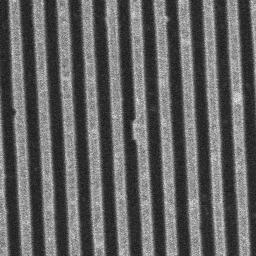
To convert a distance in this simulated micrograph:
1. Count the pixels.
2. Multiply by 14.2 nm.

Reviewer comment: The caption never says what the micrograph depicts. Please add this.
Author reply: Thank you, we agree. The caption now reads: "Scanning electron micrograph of parallel lines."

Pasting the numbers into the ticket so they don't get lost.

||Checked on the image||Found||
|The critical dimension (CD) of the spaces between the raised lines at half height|176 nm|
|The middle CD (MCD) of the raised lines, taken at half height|0.163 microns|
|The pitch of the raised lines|344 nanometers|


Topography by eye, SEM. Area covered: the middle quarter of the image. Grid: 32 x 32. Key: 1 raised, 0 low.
11000111000111000111000011000111
11000111000111000111000011000011
11000111000011000111000111000011
11000111000011000011000111000011
11000111000011000011000011000011
11000011000011000011000011000011
11000111000011000011000011000011
11000111000011000011000011000011
11000111000011000011000011000011
11000111000011000011000011000011
11000011000011000011000011000011
11000011000011000011000011100011
11000011100011000011000011100011
11000011100011100011000011100011
11000011100011100111000011100011
11000011100011100111100011100011
11100011100011100111100011100011
11100011100011100111100011100011
11100011100011100111100011100011
11100011100011100011100011100011
11100011100011100011100011100011
11100011100011100011100011100001
11100011100011100011100011100001
11100011100011100001100011100001
11100011100011100001100001100001
11100011100011100001100001100001
11100011100001100001100001100001
11100011100001100001100001110001
01100011100001100001100001110001
01100011100001100001100001100001
01100001100001100001110001100001
01100001100001100001110001110001